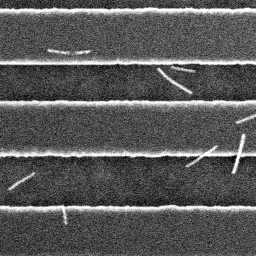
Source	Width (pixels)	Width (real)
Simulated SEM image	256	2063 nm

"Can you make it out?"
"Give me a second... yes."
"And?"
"lines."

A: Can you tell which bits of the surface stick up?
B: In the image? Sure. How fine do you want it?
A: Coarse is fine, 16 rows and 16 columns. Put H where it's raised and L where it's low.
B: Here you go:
LLLLLLLLLLLLLLLL
HHHHHHHHHHHHHHHH
HHHHHHHHHHHHHHHH
HHHHHHHHHHHHHHHH
LLLLLLLLLLLLLLLL
LLLLLLLLLLLLLLLL
HHHHHHHHHHHHHHHH
HHHHHHHHHHHHHHHH
HHHHHHHHHHHHHHHH
HHHHHHHHHHHHHHHH
LLLLLLLLLLLLLLLL
LLLLLLLLLLLLLLLL
LLLLLLLLLLLLLLLL
HHHHHHHHHHHHHHHH
HHHHHHHHHHHHHHHH
HHHHHHHHHHHHHHHH